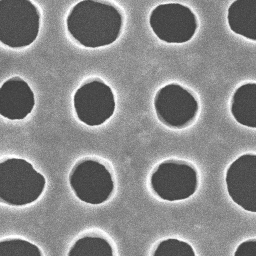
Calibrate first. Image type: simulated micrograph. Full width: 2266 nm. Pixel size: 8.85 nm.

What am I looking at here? holes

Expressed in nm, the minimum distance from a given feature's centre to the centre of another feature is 701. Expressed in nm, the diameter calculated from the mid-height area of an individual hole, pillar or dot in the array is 382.